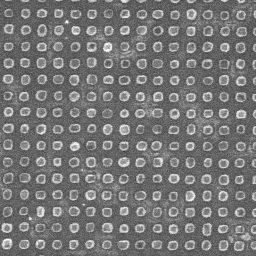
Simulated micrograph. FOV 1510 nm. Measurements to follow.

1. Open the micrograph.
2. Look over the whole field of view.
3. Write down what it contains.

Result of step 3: a regular array of raised bodies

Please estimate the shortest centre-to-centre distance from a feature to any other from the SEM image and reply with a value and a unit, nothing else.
15.9 px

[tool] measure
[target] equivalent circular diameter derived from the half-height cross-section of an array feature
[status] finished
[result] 9.1 px